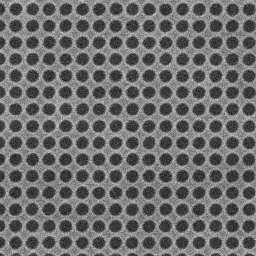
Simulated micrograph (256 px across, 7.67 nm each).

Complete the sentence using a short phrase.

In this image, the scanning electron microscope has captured a regular array of holes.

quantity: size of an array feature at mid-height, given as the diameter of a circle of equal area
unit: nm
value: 99.8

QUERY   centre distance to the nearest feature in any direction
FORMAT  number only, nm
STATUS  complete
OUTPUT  126